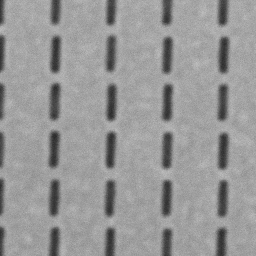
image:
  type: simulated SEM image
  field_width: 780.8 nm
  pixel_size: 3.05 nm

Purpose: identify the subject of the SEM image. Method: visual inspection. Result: a regular array of holes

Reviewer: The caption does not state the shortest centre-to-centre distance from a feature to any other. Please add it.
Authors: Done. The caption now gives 146 nanometres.